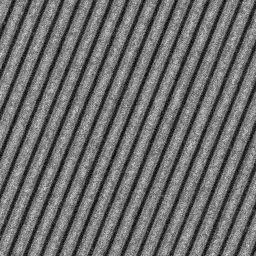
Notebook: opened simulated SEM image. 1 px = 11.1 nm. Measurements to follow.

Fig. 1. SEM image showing parallel lines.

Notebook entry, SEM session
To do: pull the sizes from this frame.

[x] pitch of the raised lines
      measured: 0.167 µm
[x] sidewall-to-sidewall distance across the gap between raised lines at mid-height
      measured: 51.4 nm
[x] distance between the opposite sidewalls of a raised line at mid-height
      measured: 0.112 micrometres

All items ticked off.